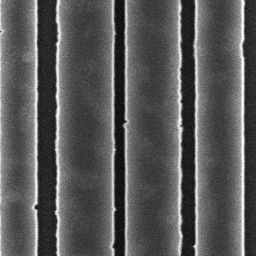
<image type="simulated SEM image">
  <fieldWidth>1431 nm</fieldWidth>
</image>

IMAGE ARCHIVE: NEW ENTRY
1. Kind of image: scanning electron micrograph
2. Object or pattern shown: one or a few lines or trenches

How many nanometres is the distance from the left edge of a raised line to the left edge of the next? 375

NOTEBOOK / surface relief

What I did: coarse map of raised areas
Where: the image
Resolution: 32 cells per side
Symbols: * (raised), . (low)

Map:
*****..*******..*******..*****..
*****..*******..*******..*****..
*****..*******..******...*****..
*****..*******..******...*****..
*****..*******..******...*****..
****...*******..******..******..
*****..*******..*******.******..
*****..*******..*******.******..
*****..*******..******...*****..
*****..*******..******...*****..
*****..*******..*******..*****..
*****..*******..******...*****..
*****..*******..*******..*****..
****...*******..*******..*****..
****...*******..*******..*****..
*****..*******..*******..*****..
*****..*******..*******..*****..
*****..*******..*******..*****..
****...*******..*******..*****..
****...*******..*******..*****..
*****..*******..******...*****..
*****..*******..*******..*****..
*****..*******..*******..*****..
*****..*******..******...*****..
*****..*******..*******..*****..
****...*******..******...*****..
****...*******..*******..*****..
*****..*******..*******..*****..
*****..*******..******...*****..
*****..*******..*******..*****..
*****..*******..*******.******..
****...*******..******..******..